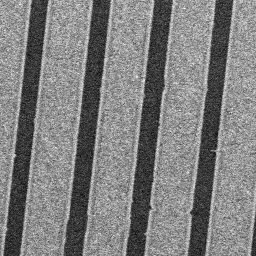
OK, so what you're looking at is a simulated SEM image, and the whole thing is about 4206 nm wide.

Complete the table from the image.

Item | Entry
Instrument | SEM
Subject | one or a few lines or trenches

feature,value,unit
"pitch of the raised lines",1010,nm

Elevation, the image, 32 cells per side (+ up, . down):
++++..+++++...+++++...+++++..+++
++++..+++++...+++++...+++++..+++
+++...+++++...+++++...++++...+++
+++...+++++...+++++..+++++...+++
+++...+++++...+++++..+++++...+++
+++...+++++..+++++...+++++...+++
+++...+++++..+++++...+++++...+++
+++..++++++..+++++...+++++...+++
+++..+++++...+++++...+++++..++++
+++..+++++...+++++...+++++..++++
+++..+++++...+++++...+++++..++++
++...+++++...+++++...+++++..++++
++...+++++...+++++..+++++...++++
++...+++++...+++++..+++++...++++
++...+++++..+++++...+++++...++++
++...+++++..+++++...+++++...++++
++..++++++..+++++...+++++..+++++
++..+++++...+++++...+++++..+++++
++..+++++...+++++...+++++..+++++
++..+++++...+++++...+++++..+++++
+...+++++...+++++...+++++..+++++
+...+++++...+++++..+++++...+++++
+...+++++...+++++..+++++...+++++
+...+++++..+++++...+++++...+++++
+...+++++..+++++...+++++...+++++
+..++++++..+++++...+++++...+++++
+..+++++...+++++...+++++..++++++
+..+++++...+++++...+++++..++++++
+..+++++...+++++...+++++..+++++.
...+++++...+++++..++++++..+++++.
...+++++...+++++..+++++...+++++.
...+++++...+++++..+++++...+++++.